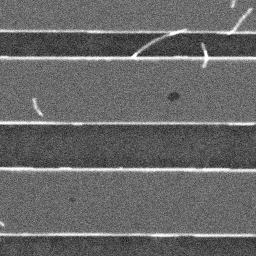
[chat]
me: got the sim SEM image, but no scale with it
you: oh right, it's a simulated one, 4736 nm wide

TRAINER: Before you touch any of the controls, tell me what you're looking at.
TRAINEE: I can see lines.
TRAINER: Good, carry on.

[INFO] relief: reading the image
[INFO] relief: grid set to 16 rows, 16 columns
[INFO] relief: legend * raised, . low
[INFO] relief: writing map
****************
****************
................
................
****************
****************
****************
****************
................
................
................
****************
****************
****************
****************
................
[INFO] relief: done